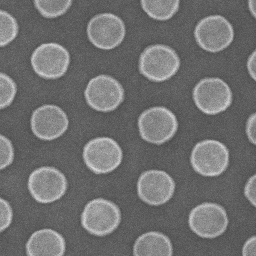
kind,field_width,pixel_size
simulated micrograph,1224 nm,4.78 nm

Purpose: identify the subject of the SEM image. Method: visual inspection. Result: a regular array of raised bodies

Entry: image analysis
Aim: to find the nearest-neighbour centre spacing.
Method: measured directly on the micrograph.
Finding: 0.295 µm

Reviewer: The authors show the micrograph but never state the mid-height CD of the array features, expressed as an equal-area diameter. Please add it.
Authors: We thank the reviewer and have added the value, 173 nm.